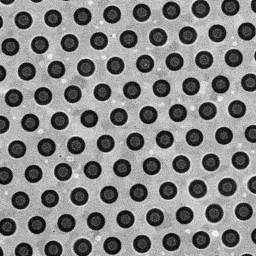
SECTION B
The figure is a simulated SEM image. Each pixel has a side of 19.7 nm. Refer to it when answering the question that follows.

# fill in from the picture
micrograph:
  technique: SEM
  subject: an array of small figures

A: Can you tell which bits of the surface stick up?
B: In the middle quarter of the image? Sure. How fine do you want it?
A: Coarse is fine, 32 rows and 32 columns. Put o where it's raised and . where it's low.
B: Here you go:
ooo.....oo.....ooo....oooo....oo
ooo.....ooo....oooo...oooo...ooo
oooo...ooooo..oooooooooooooooooo
ooooooooooooooooooooooooooooooo.
oooooooooooooooo..ooooo...oooo..
o...oooo...oooo....ooo.....oo...
....ooo.....ooo....ooo.....ooo..
.....oo.....ooo....ooo....oooo..
....oooo...ooooo..oooooo.ooooooo
o...oooooooooooooooooooooooooooo
oooooooooooooooooooo..ooooo...oo
oooooo.ooooo...oooo....ooo.....o
.ooo....ooo.....ooo.....oo.....o
.ooo.....oo.....ooo....ooo....oo
.ooo....oooo....ooo....ooooo.ooo
.oooo...ooooo.oooooooooooooooooo
ooooooooooooooooooooooooooooooo.
oooooooooo.ooooo...oooo....oooo.
o...ooooo...oooo....ooo.....oo..
o....ooo.....oo.....ooo.....oo..
o....ooo.....ooo....ooo....ooooo
o....oooo...ooooo..ooooooooooooo
oo..oooooooooooooooooooooooooooo
ooooooooooooooooooooo..ooooo...o
oooooo..ooooo...oooo....ooo.....
..ooo....ooo.....ooo....ooo.....
..ooo.....oo.....ooo....ooo....o
..ooo....oooo...ooooo..oooooo.oo
..oooo..oooooooooooooooooooooooo
ooooooooooooooooooooooooo..oooo.
ooooooooooo.ooooo...oooo....ooo.
oo....ooo....ooo.....ooo.....oo.